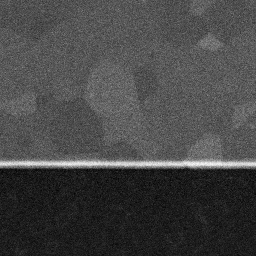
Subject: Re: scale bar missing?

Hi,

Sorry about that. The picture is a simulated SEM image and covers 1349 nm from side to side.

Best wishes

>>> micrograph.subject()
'one or a few lines or trenches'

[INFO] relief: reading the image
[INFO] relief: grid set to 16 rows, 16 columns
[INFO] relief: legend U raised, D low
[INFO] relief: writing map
UUUUUUUUUUUUUUUU
UUUUUUUUUUUUUUUU
UUUUUUUUUUUUUUUU
UUUUUUUUUUUUUUUU
UUUUUUUUUUUUUUUU
UUUUUUUUUUUUUUUU
UUUUUUUUUUUUUUUU
UUUUUUUUUUUUUUUU
UUUUUUUUUUUUUUUU
UUUUUUUUUUUUUUUU
DDDDDDDDDDDDDDDD
DDDDDDDDDDDDDDDD
DDDDDDDDDDDDDDDD
DDDDDDDDDDDDDDDD
DDDDDDDDDDDDDDDD
DDDDDDDDDDDDDDDD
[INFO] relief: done